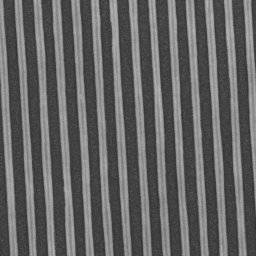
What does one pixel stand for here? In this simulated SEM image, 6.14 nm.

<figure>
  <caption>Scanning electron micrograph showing parallel lines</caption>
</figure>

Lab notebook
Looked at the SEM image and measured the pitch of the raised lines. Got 117 nm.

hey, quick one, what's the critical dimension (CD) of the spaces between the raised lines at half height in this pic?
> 82 nm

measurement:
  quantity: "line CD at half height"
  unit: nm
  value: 32.9